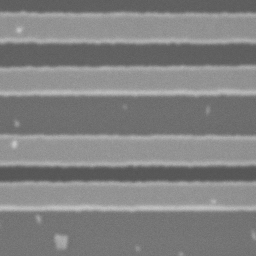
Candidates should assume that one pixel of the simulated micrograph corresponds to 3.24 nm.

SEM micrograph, lines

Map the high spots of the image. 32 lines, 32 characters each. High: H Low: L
LLLLLLLLLLLLLLLLLLLLLLLLLLLLLLLL
LLLLLLLLLLLLLLLLLLLLLLLLLLLLLLLL
HHHHHHHHHHHHHHHHHHHHHHHHHHHHHHHH
HHHHHHHHHHHHHHHHHHHHHHHHHHHHHHHH
HHHHHHHHHHHHHHHHHHHHHHHHHHHHHHHH
LLLLLLLLLLLLLLLLLLLLLLLLLLLLLLLL
LLLLLLLLLLLLLLLLLLLLLLLLLLLLLLLL
LLLLLLLLLLLLLLLLLLLLLLLLLLLLLLLL
LLLHHHLHHHHHHHHHHHHHHHHHHHHHHHHH
HHHHHHHHHHHHHHHHHHHHHHHHHHHHHHHH
HHHHHHHHHHHHHHHHHHHHHHHHHHHHHHHH
HHHHHHHHHHHHHHHHHHHHHHHHHHHHHHHH
LLLLLLLLLLLLLLLLLLLLLLLLLLLLLLLL
LLLLLLLLLLLLLLLLLLLLLLLLLLLLLLLL
LLLLLLLLLLLLLLLLLLLLLLLLLLLLLLLL
LLLLLLLLLLLLLLLLLLLLLLLLLLLLLLLL
LLLLLLLLLLLLLLLLLLLLLLLLLLLLLLLL
HHHHHHHHHHHHHHHHHHHHHHHHHHHHHHHH
HHHHHHHHHHHHHHHHHHHHHHHHHHHHHHHH
HHHHHHHHHHHHHHHHHHHHHHHHHHHHHHHH
HHHHHHHHHHHHHHHHHHHHHHHHHHHHHHHH
LLLLLLLLLLLLLLLLLLLLLLLLLLLLLLLL
LLLLLLLLLLLLLLLLLLLLLLLLLLLLLLLL
HHHHHHHHHHHHHHHHHHHHHHHHHHHHHHHH
HHHHHHHHHHHHHHHHHHHHHHHHHHHHHHHH
HHHHHHHHHHHHHHHHHHHHHHHHHHHHHHHH
LLLLLLLLLLLLLLLLLLLLLLLLLLLLLLLL
LLLLLLLLLLLLLLLLLLLLLLLLLLLLLLLL
LLLLLLLLLLLLLLLLLLLLLLLLLLLLLLLL
LLLLLLLLLLLLLLLLLLLLLLLLLLLLLLLL
LLLLLLLLLLLLLLLLLLLLLLLLLLLLLLLL
LLLLLLLLLLLLLLLLLLLLLLLLLLLLLLLL